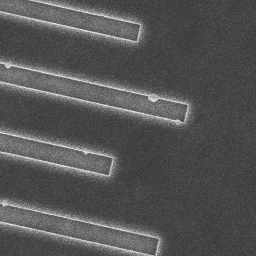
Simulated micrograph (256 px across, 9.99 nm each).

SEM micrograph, one or a few lines or trenches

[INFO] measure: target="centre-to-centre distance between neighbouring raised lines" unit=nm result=683